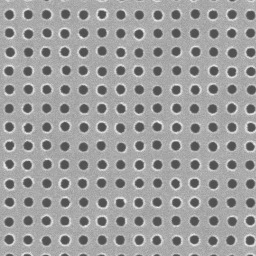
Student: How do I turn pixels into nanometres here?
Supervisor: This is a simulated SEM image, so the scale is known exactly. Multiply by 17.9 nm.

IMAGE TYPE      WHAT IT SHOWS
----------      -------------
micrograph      a regular array of holes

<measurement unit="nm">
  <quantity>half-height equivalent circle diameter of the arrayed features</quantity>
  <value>174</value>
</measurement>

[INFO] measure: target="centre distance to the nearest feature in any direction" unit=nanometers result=322